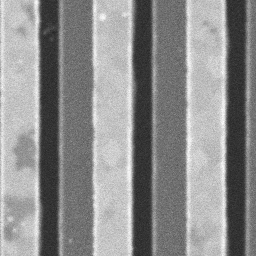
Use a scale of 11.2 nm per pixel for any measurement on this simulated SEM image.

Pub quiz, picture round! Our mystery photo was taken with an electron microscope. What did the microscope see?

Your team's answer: lines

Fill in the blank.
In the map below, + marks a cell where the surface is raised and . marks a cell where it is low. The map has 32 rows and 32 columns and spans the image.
+++++...++++++++...+++++++++...+
+++++...++++++++...+++++++++...+
+++++...++++++++...+++++++++...+
+++++...++++++++...+++++++++...+
+++++...++++++++...+++++++++...+
+++++...++++++++...+++++++++...+
+++++...++++++++...+++++++++...+
+++++...++++++++...+++++++++...+
+++++...++++++++...+++++++++...+
+++++...++++++++...+++++++++...+
+++++...++++++++...+++++++++...+
+++++...++++++++...+++++++++...+
+++++...++++++++...+++++++++...+
+++++...++++++++...+++++++++...+
+++++...++++++++...+++++++++...+
+++++...++++++++...+++++++++...+
+++++...++++++++...+++++++++...+
+++++...++++++++...+++++++++...+
+++++...++++++++...+++++++++...+
+++++...++++++++...+++++++++...+
+++++...++++++++...+++++++++...+
+++++...++++++++...+++++++++...+
+++++...++++++++...+++++++++...+
+++++...++++++++...+++++++++...+
+++++...++++++++...+++++++++...+
+++++...++++++++...+++++++++...+
+++++...++++++++...+++++++++...+
+++++...++++++++...+++++++++...+
+++++...++++++++...+++++++++...+
+++++...++++++++...+++++++++...+
+++++...++++++++...+++++++++...+
+++++...++++++++...+++++++++...+